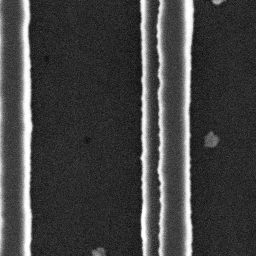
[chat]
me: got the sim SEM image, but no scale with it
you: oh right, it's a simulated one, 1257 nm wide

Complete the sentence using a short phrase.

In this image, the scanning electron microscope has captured lines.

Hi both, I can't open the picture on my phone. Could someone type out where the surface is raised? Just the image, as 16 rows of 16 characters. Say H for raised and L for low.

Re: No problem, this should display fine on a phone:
HHLLLLLLLHHHLLLL
HHLLLLLLLHHHLLLL
HHLLLLLLLHHHLLLL
HHLLLLLLLHHHLLLL
HHLLLLLLLHHHLLLL
HHLLLLLLLHHHLLLL
HHLLLLLLLHHHLLLL
HHLLLLLLLHHHLLLL
HHLLLLLLLHHHLLLL
HHLLLLLLLHHHLLLL
HHLLLLLLLHHHLLLL
HHLLLLLLLHHHLLLL
HHLLLLLLLHHHLLLL
HHLLLLLLLHHHLLLL
HHLLLLLLLHHHLLLL
HHLLLLLLLHHHLLLL